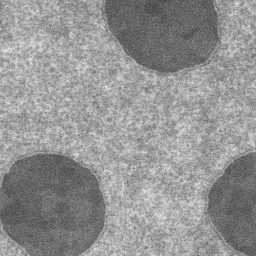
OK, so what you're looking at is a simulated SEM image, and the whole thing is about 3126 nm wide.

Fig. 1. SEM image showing raised bodies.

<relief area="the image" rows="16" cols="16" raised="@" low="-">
-------@@@@@@@--
-------@@@@@@@--
-------@@@@@@@--
--------@@@@@---
----------@-----
----------------
----------------
----------------
----------------
----------------
-@@@@---------@@
@@@@@@-------@@@
@@@@@@@------@@@
@@@@@@@------@@@
@@@@@@--------@@
-@@@@@---------@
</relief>